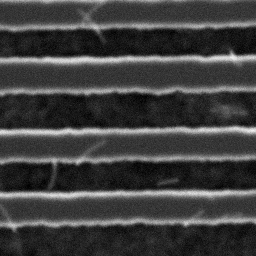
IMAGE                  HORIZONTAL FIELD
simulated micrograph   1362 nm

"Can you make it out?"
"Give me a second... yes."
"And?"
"lines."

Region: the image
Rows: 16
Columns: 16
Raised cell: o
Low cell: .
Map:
oooooooooooooooo
oooooooooooooooo
................
..............oo
oooooooooooooooo
oooooooooooooooo
................
................
oooooooooooooooo
oooooooooooooooo
................
................
oooooooooooooooo
oooooooooooooooo
................
................